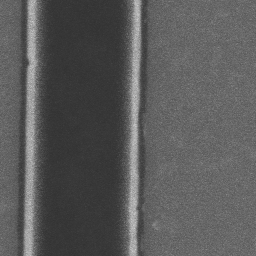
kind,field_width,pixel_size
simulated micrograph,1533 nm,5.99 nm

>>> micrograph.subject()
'one or a few lines or trenches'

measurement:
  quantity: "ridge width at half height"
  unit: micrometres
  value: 0.644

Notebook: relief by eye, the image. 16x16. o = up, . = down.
..ooooooo.......
..ooooooo.......
..ooooooo.......
..ooooooo.......
..ooooooo.......
..ooooooo.......
..oooooo........
..oooooo........
..oooooo........
..oooooo........
..oooooo........
..oooooo........
..oooooo........
..oooooo........
..oooooo........
..oooooo........